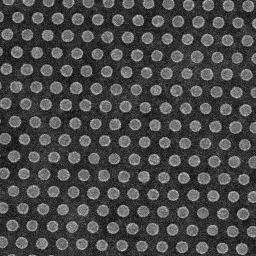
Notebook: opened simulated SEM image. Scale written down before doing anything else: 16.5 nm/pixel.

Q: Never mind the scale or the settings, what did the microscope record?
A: a regular array of raised bodies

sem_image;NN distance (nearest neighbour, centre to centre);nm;324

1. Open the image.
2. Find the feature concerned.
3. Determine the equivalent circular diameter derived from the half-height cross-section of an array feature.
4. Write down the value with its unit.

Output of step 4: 182 nanometres